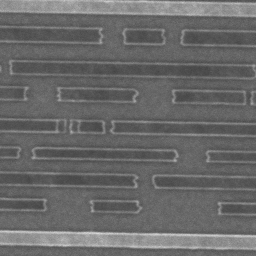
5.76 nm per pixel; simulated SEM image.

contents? parallel lines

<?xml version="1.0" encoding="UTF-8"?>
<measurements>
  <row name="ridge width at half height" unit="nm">74.8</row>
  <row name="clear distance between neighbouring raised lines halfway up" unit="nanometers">85.6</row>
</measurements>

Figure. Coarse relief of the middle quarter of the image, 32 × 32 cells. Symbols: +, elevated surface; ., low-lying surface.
++++++++++++++++++++++++++++++++
++++++++++++++++++++++++++++++++
++++++++++++++++++++++++++++++++
................................
................................
................................
++++++++++++++++++..............
++++++++++++++++++.........+++++
++++++++++++++++++.........+++++
...........................+++++
................................
................................
................................
................................
....++++++..+++++++++++++.......
....++++++..++++++++++++++++++++
....++++++..++++++++++++++++++++
.........................+++++++
................................
................................
................................
+++++++++++++++.................
++++++++++++++++++++++++++++....
++++++++++++++++++++++++++++....
................................
................................
................................
++..............................
++++++++++++++++++....++++++++++
++++++++++++++++++....++++++++++
.+++++++++++++++++.....+++++++++
................................